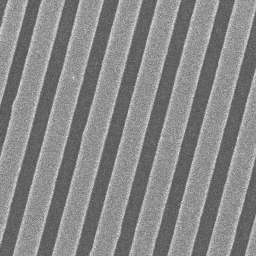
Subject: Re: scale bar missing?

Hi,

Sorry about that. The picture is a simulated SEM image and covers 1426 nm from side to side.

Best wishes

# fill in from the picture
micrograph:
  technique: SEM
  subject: parallel lines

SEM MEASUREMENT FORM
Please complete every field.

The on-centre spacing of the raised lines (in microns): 0.208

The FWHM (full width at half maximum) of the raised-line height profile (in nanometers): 127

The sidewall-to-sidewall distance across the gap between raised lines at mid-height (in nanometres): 80.1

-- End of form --